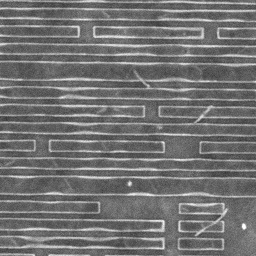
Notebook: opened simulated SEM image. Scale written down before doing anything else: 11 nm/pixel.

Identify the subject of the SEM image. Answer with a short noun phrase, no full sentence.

groups of lines, slits or small figures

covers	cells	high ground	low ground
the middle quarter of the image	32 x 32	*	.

********************************
********************************
********************************
********************************
...................*............
................................
*.************************.....*
********************************
........*....*******************
................................
................................
********************....********
********************....********
................................
................................
********************************
********************************
...........************..*******
................................
*****..**************...........
*************************.......
*************************.......
................................
................................
********************************
********************************
...............................*
................................
*******.....*******....***......
********************************
********************************
********************************